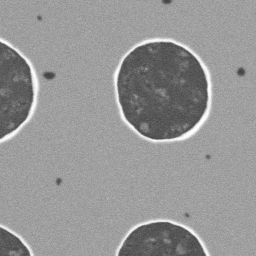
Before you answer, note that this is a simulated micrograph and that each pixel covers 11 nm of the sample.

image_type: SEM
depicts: holes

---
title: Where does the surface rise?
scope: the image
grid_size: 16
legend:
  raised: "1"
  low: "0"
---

1111111111111111
1111111111111111
1111111111111111
0111111100001111
0011111000000111
0011111000000111
0011111000000111
0011111100001111
1111111110011111
1111111111111111
1111111111111111
1111111111111111
1111111111111111
1111111111111111
0111111100001111
0011111100000111